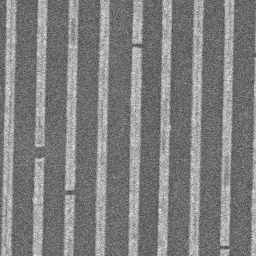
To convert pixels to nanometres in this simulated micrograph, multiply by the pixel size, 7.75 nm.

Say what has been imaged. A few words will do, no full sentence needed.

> parallel lines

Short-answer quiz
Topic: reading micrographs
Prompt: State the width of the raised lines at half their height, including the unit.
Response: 0.061 microns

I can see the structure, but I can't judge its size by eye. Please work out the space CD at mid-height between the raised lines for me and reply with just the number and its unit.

183 nanometers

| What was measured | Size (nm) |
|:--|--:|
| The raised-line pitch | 242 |